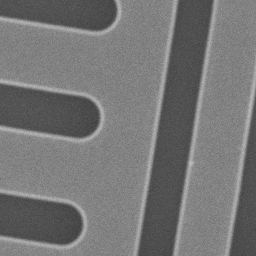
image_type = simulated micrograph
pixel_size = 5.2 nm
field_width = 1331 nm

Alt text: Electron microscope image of groups of lines, slits or small figures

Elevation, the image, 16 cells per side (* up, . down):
.......****..***
**.....****..***
***********..***
**********...***
**********...***
..********...***
......****..****
......****..****
***...****..***.
**********..***.
*********...***.
*********...***.
...******..****.
.....****..****.
.....****..***..
*********..***..